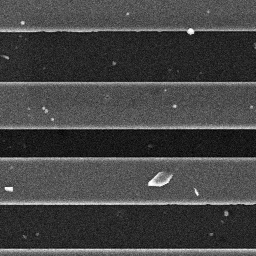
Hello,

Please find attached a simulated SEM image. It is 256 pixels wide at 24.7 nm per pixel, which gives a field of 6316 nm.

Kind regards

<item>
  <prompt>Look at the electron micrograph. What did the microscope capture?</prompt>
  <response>lines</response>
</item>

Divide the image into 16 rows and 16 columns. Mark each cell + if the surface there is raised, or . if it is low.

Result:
++++++++++++++++
++++++++++++++++
................
................
................
++++++++++++++++
++++++++++++++++
++++++++++++++++
................
................
++++++++++++++++
++++++++++++++++
++++++++++++++++
................
................
................